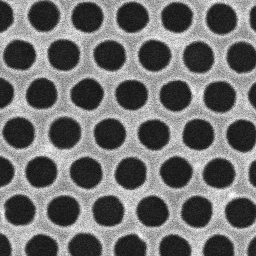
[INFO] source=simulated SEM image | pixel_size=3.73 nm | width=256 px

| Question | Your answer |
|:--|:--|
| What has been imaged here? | a regular array of holes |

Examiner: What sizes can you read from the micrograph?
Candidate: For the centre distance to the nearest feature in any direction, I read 0.165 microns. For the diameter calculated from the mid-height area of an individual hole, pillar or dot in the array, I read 120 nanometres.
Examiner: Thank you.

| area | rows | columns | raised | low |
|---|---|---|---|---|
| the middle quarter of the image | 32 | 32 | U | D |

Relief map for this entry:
DDDUUUUUUDDDDDDUUUUUDDDDDDUUUUUD
DUUUUUUUUUDDDUUUUUUUUDDDUUUUUUUD
UUUUUUUUUUUUUUUUUUUUUUUUUUUUUUUU
UUUUUUUUUUUUUUUUUUUUUUUUUUUUUUUU
UUUUDDDDDUUUUUUDDDDUUUUUUUDDDDUU
UUDDDDDDDUUUUDDDDDDDUUUUDDDDDDDU
UUDDDDDDDDUUUDDDDDDDDUUUDDDDDDDD
UUDDDDDDDDUUUDDDDDDDDUUUDDDDDDDD
UUDDDDDDDDUUUDDDDDDDDUUUDDDDDDDD
UUDDDDDDDUUUUDDDDDDDDUUUDDDDDDDD
UUUDDDDDDUUUUUDDDDDDUUUUUDDDDDDU
UUUUUDDDUUUUUUUUDDUUUUUUUUDDDDUU
UUUUUUUUUUUUUUUUUUUUUUUUUUUUUUUU
DDUUUUUUUUUDUUUUUUUUUUUUUUUUUUUU
DDDUUUUUUDDDDDUUUUUUDDDDDUUUUUUD
DDDDUUUUDDDDDDDUUUUDDDDDDDUUUUDD
DDDDUUUUDDDDDDDUUUUDDDDDDDUUUUDD
DDDDUUUDDDDDDDDDUUDDDDDDDDDUUDDD
DDDDUUUUDDDDDDDUUUUDDDDDDDUUUDDD
DDDDUUUUDDDDDDDUUUUDDDDDDDUUUUDD
DDDUUUUUUDDDDDUUUUUUDDDDDUUUUUUD
UUUUUUUUUUUUDUUUUUUUUUDDUUUUUUUU
UUUUUUUUUUUUUUUUUUUUUUUUUUUUUUUU
UUUUDDDUUUUUUUUUDDUUUUUUUUDDDDUU
UUUDDDDDDUUUUUDDDDDDUUUUUDDDDDDU
UUDDDDDDDUUUUDDDDDDDUUUUDDDDDDDD
UDDDDDDDDUUUUDDDDDDDDUUUDDDDDDDD
UDDDDDDDDDUUUDDDDDDDDUUUDDDDDDDD
UUDDDDDDDDUUUDDDDDDDDUUUDDDDDDDD
UUUDDDDDDUUUUDDDDDDDUUUUUDDDDDDU
UUUDDDDDUUUUUUDDDDDUUUUUUUDDDDUU
UUUUUUUUUUUUUUUUUUUUUUUUUUUUUUUU